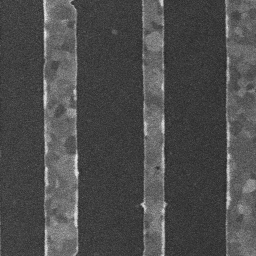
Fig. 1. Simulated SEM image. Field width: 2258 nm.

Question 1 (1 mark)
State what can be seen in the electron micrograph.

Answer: one or a few lines or trenches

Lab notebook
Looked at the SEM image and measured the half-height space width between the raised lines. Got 567 nm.